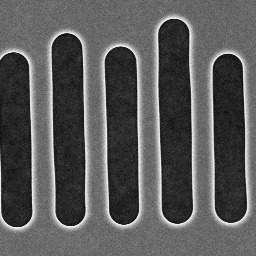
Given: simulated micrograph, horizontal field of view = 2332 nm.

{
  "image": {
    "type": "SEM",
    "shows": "groups of lines, slits or small figures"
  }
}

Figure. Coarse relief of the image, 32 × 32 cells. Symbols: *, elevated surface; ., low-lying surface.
********************************
********************************
*********************..*********
********************...*********
*******..***********....********
*******...**********....********
******....****...***....********
...***....***....***....***...**
....**....***....***....***...**
....**....***....***....***...**
....**....***....***....***....*
....**....***....***....***....*
....**.....**....***....***....*
....**.....**....***....***....*
....***....**....***....***....*
....***....**....***....***....*
....***....**....***....***....*
....***....**....***....***....*
....***....**....***....***....*
....***....**....***....***....*
....***....**....***....***....*
....***....**....***....***....*
....***....**....***....***....*
....***....**....***....***....*
....***....***...***....***....*
....***....***...***....***....*
....***....***...***....***....*
*...***...****...****..*****..**
********************************
********************************
********************************
********************************